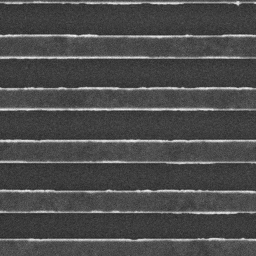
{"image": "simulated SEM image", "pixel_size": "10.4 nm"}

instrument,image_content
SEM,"lines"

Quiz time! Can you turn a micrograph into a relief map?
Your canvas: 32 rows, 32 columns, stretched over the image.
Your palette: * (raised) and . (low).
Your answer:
................................
................................
................................
................................
*************..........*....****
********************************
********************************
................................
................................
................................
................................
********************************
********************************
********************************
................................
................................
................................
................................
********************************
********************************
................................
................................
................................
................................
********************************
********************************
********************************
................................
................................
................................
********************************
********************************